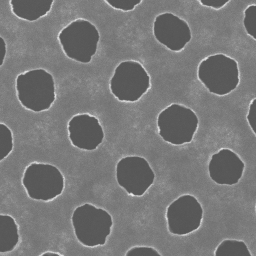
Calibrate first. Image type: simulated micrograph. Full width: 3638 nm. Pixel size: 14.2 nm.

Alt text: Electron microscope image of a regular array of holes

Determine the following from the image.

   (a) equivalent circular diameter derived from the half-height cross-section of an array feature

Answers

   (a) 549 nm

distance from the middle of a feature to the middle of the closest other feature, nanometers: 912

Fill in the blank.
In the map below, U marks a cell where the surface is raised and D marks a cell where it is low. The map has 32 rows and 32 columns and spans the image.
UDDDDDUUUUUUUUDDDUUUUUUUUUDDUUUU
UUDDDDUUUUUUUUUUUUUUUUUUUUUUUUUD
UUUUUUUUUUUUUUUUUUUDDDDUUUUUUUUD
UUUUUUUUDDDDUUUUUUUDDDDDUUUUUUUD
UUUUUUUDDDDDUUUUUUUDDDDDUUUUUUUD
DUUUUUUUDDDDUUUUUUUUDDDUUUUUUUUU
DUUUUUUUDDDDUUUUUUUUUUUUUUUUUUUU
UUUUUUUUUUDUUUUUUUUUUUUUUUDDDUUU
UUUUUUUUUUUUUUUDDDUUUUUUUDDDDDUU
UUDDDDUUUUUUUUDDDDDUUUUUUDDDDDUU
UUDDDDDUUUUUUUDDDDDUUUUUUUDDDDUU
UUDDDDDUUUUUUUDDDDUUUUUUUUUDDUUU
UUDDDDDUUUUUUUUDDUUUUUUUUUUUUUUU
UUUUDDUUUUUUUUUUUUUUUDDUUUUUUUUD
UUUUUUUUUUDUUUUUUUUUDDDDDUUUUUUD
UUUUUUUUUDDDUUUUUUUUDDDDDUUUUUUD
DUUUUUUUUDDDDUUUUUUUDDDDUUUUUUUU
DDUUUUUUUDDDDUUUUUUUUDDDUUUUUUUU
DDUUUUUUUUDDUUUUUUUUUUUUUUUUUUUU
DUUUUUUUUUUUUUUUUUUUUUUUUUUDDDUU
UUUUDUUUUUUUUUUDDDDUUUUUUUDDDDUU
UUUDDDDUUUUUUUUDDDDUUUUUUUDDDDUU
UUUDDDDDUUUUUUUDDDDUUUUUUUUDDDUU
UUUDDDDDUUUUUUUUDDUUUUUUUUUUUUUU
UUUUDDDUUUUUUUUUUUUUUUUDUUUUUUUU
UUUUUUUUUUUUUUUUUUUUUDDDDUUUUUUU
UUUUUUUUUDDDDUUUUUUUUDDDDUUUUUUU
DDUUUUUUUDDDDDUUUUUUUDDDDUUUUUUU
DDUUUUUUUDDDDDUUUUUUUDDDDUUUUUUU
DDUUUUUUUUDDDUUUUUUUUUUUUUUUUUUU
DDUUUUUUUUUDDUUUUUUUUUUUUUUUDDDU
DUUUUUUUUUUUUUUUDDDDUUUUUUUDDDDU